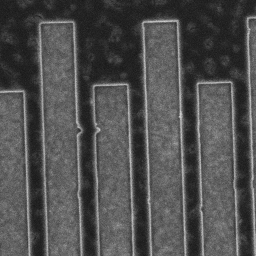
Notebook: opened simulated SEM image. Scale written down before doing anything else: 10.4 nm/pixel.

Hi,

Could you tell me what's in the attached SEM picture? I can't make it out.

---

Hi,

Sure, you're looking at parallel lines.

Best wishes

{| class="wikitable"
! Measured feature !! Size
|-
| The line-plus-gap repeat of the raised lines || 539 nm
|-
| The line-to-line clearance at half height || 0.349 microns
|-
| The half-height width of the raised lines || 195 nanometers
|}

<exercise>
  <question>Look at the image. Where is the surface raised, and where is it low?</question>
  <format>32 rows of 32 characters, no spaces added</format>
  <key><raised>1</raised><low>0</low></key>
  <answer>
11111111111111111111111111111111
11111111111111111111111111111111
11111111111111111111111111111110
11111000011111111100001111111110
11111000011111111100001111111110
11111000011111111100001111111110
11111000011111111100001111111110
11111000011111111100001111111110
11111000011111111100001111111110
11111000011111111100001111111110
11111000011111111100001110000110
10011000011100001100001110000110
00011000011100001100001110000110
00011000001100001100000110000110
00011000001100001100001110000110
00011000001100001100000110000110
00011000001100001100000110000110
00011000001100001100000110000110
00011100001100001110000110000110
00011100001100001110000110000111
00011100001100001110000110000111
00011100001100001110000110000111
00011100001100001110000110000111
00011100001100001110000110000111
00011100001100001110000110000111
00001100001100001110000110000111
00001100001100000110000110000111
00001100001100000110000110000011
00001100001100000110000110000011
00001100001100000110000110000011
00001100001100000110000110000011
00001100001100000110000110000011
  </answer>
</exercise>